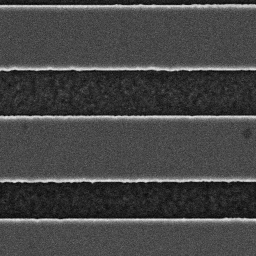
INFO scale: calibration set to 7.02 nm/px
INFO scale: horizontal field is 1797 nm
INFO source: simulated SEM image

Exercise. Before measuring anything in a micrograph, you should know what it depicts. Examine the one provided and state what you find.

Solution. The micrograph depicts lines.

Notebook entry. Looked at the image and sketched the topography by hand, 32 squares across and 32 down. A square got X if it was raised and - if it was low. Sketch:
--------------------------------
XXXXXXXXXXXXXXXXXXXXXXXXXXXXXXXX
XXXXXXXXXXXXXXXXXXXXXXXXXXXXXXXX
XXXXXXXXXXXXXXXXXXXXXXXXXXXXXXXX
XXXXXXXXXXXXXXXXXXXXXXXXXXXXXXXX
XXXXXXXXXXXXXXXXXXXXXXXXXXXXXXXX
XXXXXXXXXXXXXXXXXXXXXXXXXXXXXXXX
XXXXXXXXXXXXXXXXXXXXXXXXXXXXXXXX
XXXXXXXXXXXXXXXXXXXXXXXXXXXXXXXX
--------------------------------
--------------------------------
--------------------------------
--------------------------------
--------------------------------
--------------------------------
XXXXXXXXXXXXXXXXXXXXXXXXXXXXXXXX
XXXXXXXXXXXXXXXXXXXXXXXXXXXXXXXX
XXXXXXXXXXXXXXXXXXXXXXXXXXXXXXXX
XXXXXXXXXXXXXXXXXXXXXXXXXXXXXXXX
XXXXXXXXXXXXXXXXXXXXXXXXXXXXXXXX
XXXXXXXXXXXXXXXXXXXXXXXXXXXXXXXX
XXXXXXXXXXXXXXXXXXXXXXXXXXXXXXXX
XXXXXXXXXXXXXXXXXXXXXXXXXXXXXXXX
--------------------------------
--------------------------------
--------------------------------
--------------------------------
XXXXXXXXXXXXXXXXXXXXXXXXXXXXXXXX
XXXXXXXXXXXXXXXXXXXXXXXXXXXXXXXX
XXXXXXXXXXXXXXXXXXXXXXXXXXXXXXXX
XXXXXXXXXXXXXXXXXXXXXXXXXXXXXXXX
XXXXXXXXXXXXXXXXXXXXXXXXXXXXXXXX